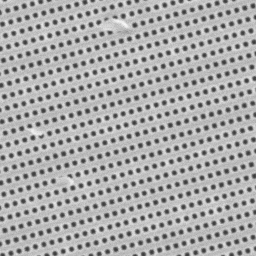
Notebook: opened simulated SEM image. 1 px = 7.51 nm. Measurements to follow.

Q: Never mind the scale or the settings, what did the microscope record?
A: a regular array of holes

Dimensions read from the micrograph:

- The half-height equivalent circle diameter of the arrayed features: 43.2 nanometers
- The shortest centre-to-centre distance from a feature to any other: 62.7 nanometers